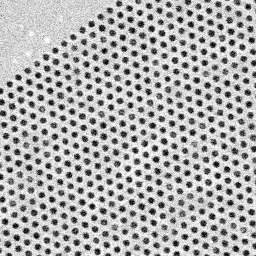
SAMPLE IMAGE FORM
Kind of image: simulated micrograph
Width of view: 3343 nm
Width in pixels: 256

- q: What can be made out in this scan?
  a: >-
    a regular array of holes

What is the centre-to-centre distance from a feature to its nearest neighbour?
144 nm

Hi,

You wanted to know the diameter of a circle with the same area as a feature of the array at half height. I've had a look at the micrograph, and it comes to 98.9 nm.